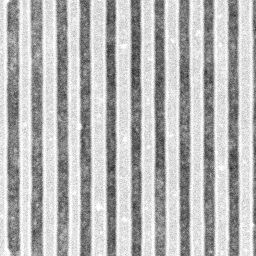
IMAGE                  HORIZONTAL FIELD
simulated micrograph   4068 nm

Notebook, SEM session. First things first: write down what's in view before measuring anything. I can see parallel lines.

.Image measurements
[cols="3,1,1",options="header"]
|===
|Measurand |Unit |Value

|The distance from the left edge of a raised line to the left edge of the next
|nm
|389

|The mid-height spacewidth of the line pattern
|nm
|199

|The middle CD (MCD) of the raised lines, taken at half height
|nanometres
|199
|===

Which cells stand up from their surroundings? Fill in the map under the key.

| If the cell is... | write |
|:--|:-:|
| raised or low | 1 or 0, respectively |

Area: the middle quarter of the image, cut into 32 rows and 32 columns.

01110001110001110000110000111000
01110001110001110000110000111000
01110001110001110000110000111000
01110001110001110001110000111000
01110001110001110000110000111000
01110001110001110000110000111000
01110001110001110000110000110000
01110001110001110000110000110000
01110001110001110000110000110000
01110001110001110000110000111000
01110001110001110000110000111000
01110001110001110000110000111000
01110001110001110000110001111000
01110001110001110000110000111000
01110001110001110000111000111000
01110001110001110000111000111000
01110001110001110000111000111000
01110001110001110000111000111000
01110001110001110000111000111000
01110001110001111000111000111000
01110001110001111000111000111000
01110001110001111000111000111000
01110001110001111000111000111000
00110001110001111001111000111000
00110001110001111001111000111000
00110001110001111001111000111000
00110001110001111000110000111000
00110001110001111000110000111000
01110001110001111000110000111000
01110001110001111000110000111000
01110001110001111000110000111000
01110001110001111000110000111000